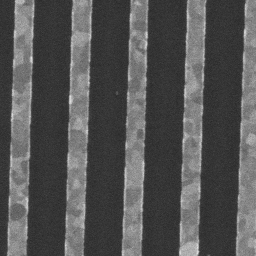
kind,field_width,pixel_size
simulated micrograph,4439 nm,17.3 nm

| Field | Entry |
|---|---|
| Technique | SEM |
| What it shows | lines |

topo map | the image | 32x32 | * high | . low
..**.....**.....**.....***.....*
..**.....**.....**.....***.....*
..**.....**.....**.....***.....*
..**.....**.....**.....***.....*
..**.....**.....**.....***.....*
..**.....**.....**.....**......*
..**.....**.....**.....**.....**
..**.....**.....**.....**.....**
..**.....**.....**.....**.....**
..**.....**.....**.....**.....**
..**.....**.....**.....**.....**
..**.....**.....**.....**.....**
..**.....**.....**.....**.....**
..**.....**.....**.....**.....**
..**.....**.....**.....**.....**
..**.....**.....**.....**.....**
..**.....**.....**.....**.....**
.***.....**.....**.....**.....**
.***.....**.....**.....**.....**
.***.....**.....**.....**.....**
.***.....**.....**.....**.....**
.***.....**.....**.....**.....**
.***....***.....**.....**.....**
.***....***.....**.....**.....**
.**.....***.....**.....**.....**
.**.....***.....**.....**.....**
.**.....***.....**.....**.....**
.**.....***....***.....**.....**
.**.....**.....***.....**.....**
.**.....**.....***.....**.....**
.**.....**.....***.....**.....**
.**.....**.....***....***.....**